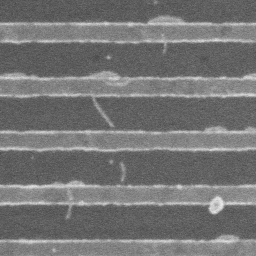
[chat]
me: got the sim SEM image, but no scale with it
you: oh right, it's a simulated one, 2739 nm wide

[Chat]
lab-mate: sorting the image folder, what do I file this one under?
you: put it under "lines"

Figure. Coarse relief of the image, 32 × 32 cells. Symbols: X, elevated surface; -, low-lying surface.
--------------------------------
--------------------------------
--------------------------------
XXXXXXXXXXXXXXXXXXXXXXXXXXXXXXXX
XXXXXXXXXXXXXXXXXXXXXXXXXXXXXXXX
--------------------------------
--------------------------------
--------------------------------
--------------------------------
--------------------------------
XXXXXXXXXXXXXXXXXXXXXXXXXXXXXXXX
XXXXXXXXXXXXXXXXXXXXXXXXXXXXXXXX
--------------------------------
--------------------------------
--------------------------------
--------------------------------
XX------XXXXXXXX-X---XXXX--X-XX-
XXXXXXXXXXXXXXXXXXXXXXXXXXXXXXXX
XXXXXXXXXXXXXXXXXXXXXXXXXXXXXXXX
--------------------------------
--------------------------------
--------------------------------
--------------------------------
XXXXXXXXXXXXXXXXXXXXXXXXXXXXXXXX
XXXXXXXXXXXXXXXXXXXXXXXXXXXXXXXX
X-------X-X----XX---X----XXX----
--------------------------X-----
--------------------------------
--------------------------------
--------------------------------
XXXXXXXXXXXXXXXXXXXXXXXXXXXXXXXX
XXXXXXXXXXXXXXXXXXXXXXXXXXXXXXXX